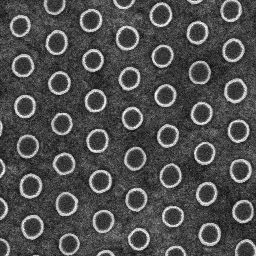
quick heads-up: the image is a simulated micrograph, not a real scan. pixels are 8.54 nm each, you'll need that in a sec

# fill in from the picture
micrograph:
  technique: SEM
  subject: a regular array of raised bodies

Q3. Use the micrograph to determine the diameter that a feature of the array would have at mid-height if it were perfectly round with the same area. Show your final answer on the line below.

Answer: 181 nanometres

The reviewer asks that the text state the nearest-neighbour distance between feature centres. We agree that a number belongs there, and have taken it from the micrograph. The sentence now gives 340 nanometers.